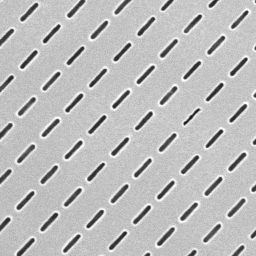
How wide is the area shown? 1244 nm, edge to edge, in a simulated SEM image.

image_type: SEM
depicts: a regular array of holes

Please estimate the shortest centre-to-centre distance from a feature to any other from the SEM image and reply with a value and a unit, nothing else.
153 nanometers